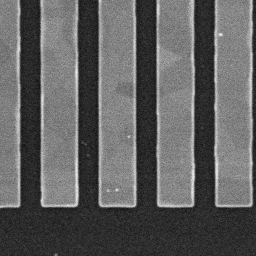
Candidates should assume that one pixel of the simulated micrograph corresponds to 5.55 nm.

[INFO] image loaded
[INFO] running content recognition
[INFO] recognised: wiring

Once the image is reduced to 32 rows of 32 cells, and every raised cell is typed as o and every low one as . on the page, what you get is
oo...ooooo..ooooo...oooo...oooo.
oo...ooooo..ooooo...oooo...oooo.
oo...ooooo..ooooo...oooo...oooo.
oo...ooooo..ooooo...oooo...oooo.
oo...ooooo..ooooo...oooo...oooo.
oo...ooooo..ooooo...oooo...oooo.
oo...ooooo..ooooo...oooo...oooo.
oo...ooooo..ooooo...oooo...oooo.
oo...ooooo..ooooo...oooo...oooo.
oo...ooooo..ooooo...oooo...oooo.
oo...ooooo..ooooo...oooo...oooo.
oo...ooooo..ooooo...oooo...oooo.
oo...ooooo..ooooo...oooo...oooo.
oo...ooooo..ooooo...oooo...oooo.
oo...ooooo..ooooo...oooo...oooo.
oo...ooooo..ooooo...oooo...oooo.
oo...ooooo..ooooo...oooo...oooo.
oo...ooooo..ooooo...oooo...oooo.
oo...ooooo..ooooo...oooo...oooo.
oo...ooooo..ooooo...oooo...oooo.
oo...ooooo..ooooo...oooo...oooo.
oo...ooooo..ooooo...oooo...oooo.
oo...ooooo..ooooo...oooo...oooo.
oo...ooooo..ooooo...oooo...oooo.
oo...ooooo..ooooo...oooo...oooo.
oo...ooooo...oooo...oooo...oooo.
................................
................................
................................
................................
................................
................................